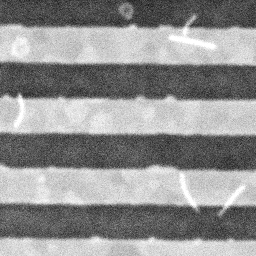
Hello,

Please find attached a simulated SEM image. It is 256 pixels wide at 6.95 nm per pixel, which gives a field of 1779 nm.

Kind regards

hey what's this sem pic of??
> lines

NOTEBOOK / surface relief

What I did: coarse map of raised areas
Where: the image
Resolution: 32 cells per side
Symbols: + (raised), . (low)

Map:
................................
................................
................................
+++.+..................+........
++++++++++++++++++++++++++++++++
++++++++++++++++++++++++++++++++
++++++++++++++++++++++++++++++++
++++++++++++++++++++++++++++++++
................................
................................
................................
................................
++++++++++++++..................
++++++++++++++++++++++++++++++++
++++++++++++++++++++++++++++++++
++++++++++++++++++++++++++++++++
.+++++++++++++++++++++++++++++++
................................
................................
................................
................................
++++++++++++++++++++++++++++++++
++++++++++++++++++++++++++++++++
++++++++++++++++++++++++++++++++
++++++++++++++++++++++++++++++++
......................++++++++++
................................
................................
................................
................................
++++++++++++++++++++++++++++++++
++++++++++++++++++++++++++++++++